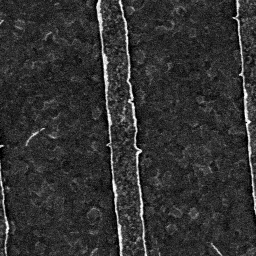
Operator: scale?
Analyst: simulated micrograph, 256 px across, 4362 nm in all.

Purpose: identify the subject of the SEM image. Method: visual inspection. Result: one or a few lines or trenches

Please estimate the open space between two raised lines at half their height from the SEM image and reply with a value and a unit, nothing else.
1910 nanometers